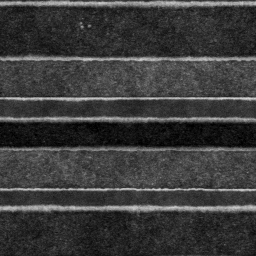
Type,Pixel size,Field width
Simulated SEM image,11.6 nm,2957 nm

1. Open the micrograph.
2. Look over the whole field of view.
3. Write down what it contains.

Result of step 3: lines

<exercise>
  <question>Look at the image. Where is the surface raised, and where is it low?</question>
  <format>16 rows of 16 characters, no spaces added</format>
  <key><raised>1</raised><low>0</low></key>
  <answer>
0000000000000000
0000000000000000
0000000000000000
0000000000000000
1111111111111111
1111111111111111
1111111111111111
0100110000000001
0000000000000000
1111111111111111
1111111111111111
1111111111111111
1111111111111111
0000000000000000
0000000000000000
0000000000000000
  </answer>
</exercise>